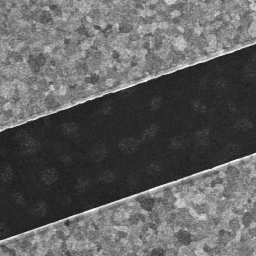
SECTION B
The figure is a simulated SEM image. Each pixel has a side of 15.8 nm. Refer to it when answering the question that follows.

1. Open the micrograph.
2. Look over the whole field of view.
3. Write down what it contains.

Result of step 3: one or a few lines or trenches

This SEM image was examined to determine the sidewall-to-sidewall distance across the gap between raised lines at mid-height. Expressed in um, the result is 1.65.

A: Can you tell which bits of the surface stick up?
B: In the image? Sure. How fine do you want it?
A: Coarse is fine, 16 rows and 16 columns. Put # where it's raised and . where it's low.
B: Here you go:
################
################
################
##############..
###########.....
########........
#####...........
##..............
................
................
.............###
..........######
........########
.....###########
..##############
################